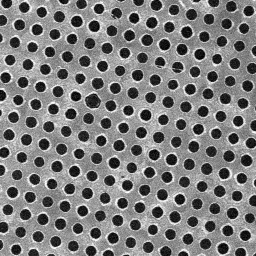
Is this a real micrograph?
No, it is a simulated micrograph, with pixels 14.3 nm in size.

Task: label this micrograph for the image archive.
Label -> a regular array of holes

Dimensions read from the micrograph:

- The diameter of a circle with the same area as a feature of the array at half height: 11.5 pixels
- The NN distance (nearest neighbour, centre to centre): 258 nm